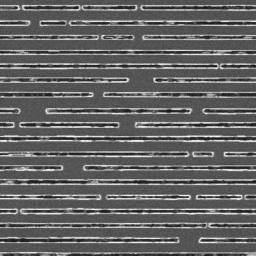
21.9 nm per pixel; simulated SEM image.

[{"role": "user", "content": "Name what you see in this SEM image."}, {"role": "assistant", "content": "parallel lines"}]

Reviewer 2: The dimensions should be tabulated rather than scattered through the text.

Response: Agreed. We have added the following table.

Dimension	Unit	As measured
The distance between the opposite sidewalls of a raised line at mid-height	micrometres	0.101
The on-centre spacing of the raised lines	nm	319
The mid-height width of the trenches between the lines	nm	216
